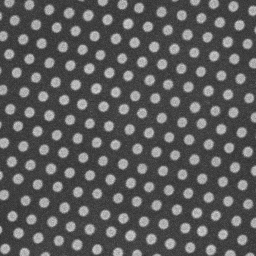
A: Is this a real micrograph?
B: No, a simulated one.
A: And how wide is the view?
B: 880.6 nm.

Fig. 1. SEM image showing a regular array of raised bodies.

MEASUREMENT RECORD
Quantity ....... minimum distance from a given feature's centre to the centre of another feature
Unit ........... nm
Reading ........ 65.3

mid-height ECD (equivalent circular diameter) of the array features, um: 0.0329